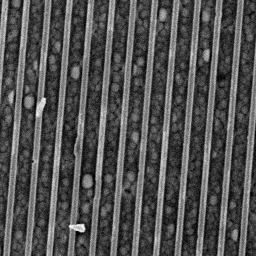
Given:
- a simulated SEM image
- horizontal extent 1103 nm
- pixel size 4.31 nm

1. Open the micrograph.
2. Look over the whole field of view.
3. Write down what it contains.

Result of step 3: parallel lines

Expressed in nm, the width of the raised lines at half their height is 25.2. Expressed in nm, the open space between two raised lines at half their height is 67.2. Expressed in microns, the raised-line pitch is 0.092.